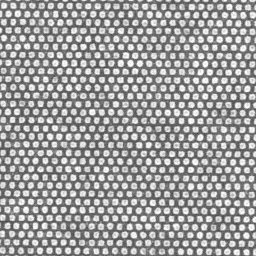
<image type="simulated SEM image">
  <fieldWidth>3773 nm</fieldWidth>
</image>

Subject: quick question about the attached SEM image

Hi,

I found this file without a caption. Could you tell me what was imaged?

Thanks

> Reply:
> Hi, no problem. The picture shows a regular array of raised bodies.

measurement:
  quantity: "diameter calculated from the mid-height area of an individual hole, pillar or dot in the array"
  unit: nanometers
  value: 76.2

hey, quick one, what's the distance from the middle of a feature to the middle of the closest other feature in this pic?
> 0.132 micrometres